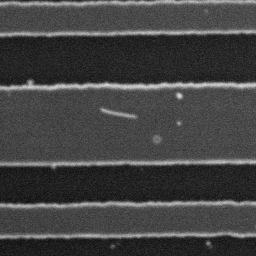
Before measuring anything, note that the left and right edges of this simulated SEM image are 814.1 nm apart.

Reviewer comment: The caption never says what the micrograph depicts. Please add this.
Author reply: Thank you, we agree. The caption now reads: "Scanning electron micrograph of lines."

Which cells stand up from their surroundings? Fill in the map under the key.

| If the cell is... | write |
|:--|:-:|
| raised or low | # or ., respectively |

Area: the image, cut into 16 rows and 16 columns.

################
################
................
................
................
################
################
################
################
################
................
................
................
################
################
................